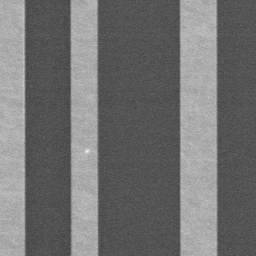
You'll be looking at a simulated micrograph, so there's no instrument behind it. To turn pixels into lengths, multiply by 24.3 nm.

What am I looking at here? groups of lines, slits or small figures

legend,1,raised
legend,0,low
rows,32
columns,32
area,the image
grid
11100000011100000000000111100000
11100000011100000000000111100000
11100000011100000000000111100000
11100000011100000000000111100000
11100000011100000000000111100000
11100000011100000000000111100000
11100000011100000000000111100000
11100000011100000000000111100000
11100000011100000000000111100000
11100000011100000000000111100000
11100000011100000000000111100000
11100000011100000000000111100000
11100000011100000000000111100000
11100000011100000000000111100000
11100000011100000000000111100000
11100000011100000000000111100000
11100000011100000000000111100000
11100000011100000000000111100000
11100000011100000000000111100000
11100000011100000000000111100000
11100000011100000000000111100000
11100000011100000000000111100000
11100000011100000000000111100000
11100000011100000000000111100000
11100000011100000000000111100000
11100000011100000000000111100000
11100000011100000000000111100000
11100000011100000000000111100000
11100000011100000000000111100000
11100000011100000000000111100000
11100000011100000000000111100000
11100000011100000000000111100000